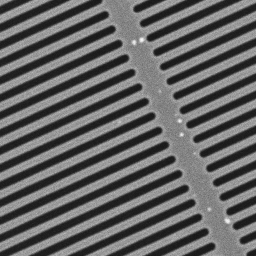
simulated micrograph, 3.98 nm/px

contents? groups of lines, slits or small figures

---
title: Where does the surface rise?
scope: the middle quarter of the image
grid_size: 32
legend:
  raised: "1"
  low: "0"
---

00001111100000111111111100001111
00111100000011110011111100111110
11110000011111000011111111110000
11000001111000001111111111000001
00000111100000111111111111000111
00011110000011111001111111111110
01111000001111100001111111111000
11100000111100000111111111100000
10000011110000011111011111100111
00001111000001111100011111111111
01111100000111100000111111111100
11110000011110000011111111111000
11000001111000001111100111111001
00001111100000111110000111111111
00111110000011110000011111111110
11111000011111000001111111111110
11000001111100000111100001111111
00000111110000011110000011111111
00011111000001111000001111111111
01111000001111100000111100111111
11100000111110000011110000111111
10000011111000001111000001111111
00001111100000111100000111111111
00111100000111110000011110001111
11110000011111000001111000001111
11000001111000000111100000111111
00000111100000111110000011111111
00111110000011110000001111000011
11111000001111000000111100000111
11100000111100000011110000011111
10000011110000011110000001111001
00011111000001111000001111100001